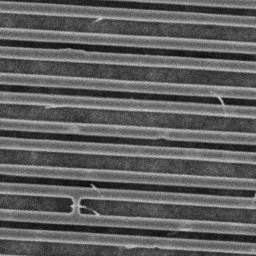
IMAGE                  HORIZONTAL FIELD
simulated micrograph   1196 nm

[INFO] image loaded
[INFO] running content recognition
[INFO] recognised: parallel lines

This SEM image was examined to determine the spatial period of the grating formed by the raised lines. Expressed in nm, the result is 106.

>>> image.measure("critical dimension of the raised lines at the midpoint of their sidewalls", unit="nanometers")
51.2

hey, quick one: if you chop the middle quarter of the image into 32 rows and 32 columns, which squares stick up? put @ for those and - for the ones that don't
-----------------------@@@@@@@@@
--------------------------------
--------------------------------
@@@@@---------------------------
@@@@@@@@@@@@@@@@@@--------------
@@@@@@@@@@@@@@@@@@@@@@@@@@@@@@@@
-----------@@@@@@@@@@@@@@@@@@@@@
--------------------------@@@@@@
@@@@@@@@@-----------------------
@@@@@@@@@@@@@@@@@@@@@@@@@-------
@@@@@@@@@@@@@@@@@@@@@@@@@@@@@@@@
----------------@@@@@@@@@@@@@@@@
--------------------------------
--------------------------------
--------------------------------
@@@@@@@@@@@@@@@-----------------
@@@@@@@@@@@@@@@@@@@@@@@@@@@@----
---@@@@@@@@@@@@@@@@@@@@@@@@@@@@@
-------------------@@@@@@@@@@@@@
@@------------------------------
@@@@@@@@@@@@@@@@@@@-------------
@@@@@@@@@@@@@@@@@@@@@@@@@@@@@@@@
----------@@@@@@@@@@@@@@@@@@@@@@
---------------------------@@@@@
--------------------------------
--------------------------------
@@@@@@@@@-----------------------
@@@@@@@@@@@@@@@@@@@@@@@@@@------
@@@@@@@@@@@@@@@@@@@@@@@@@@@@@@@@
-------------@@@@@@@@@@@@@@@@@@@
------------------------------@@
@@@@@@@@@@@@@-------------------